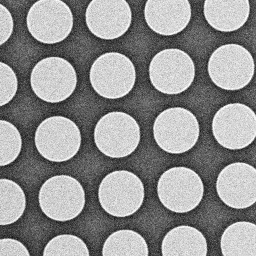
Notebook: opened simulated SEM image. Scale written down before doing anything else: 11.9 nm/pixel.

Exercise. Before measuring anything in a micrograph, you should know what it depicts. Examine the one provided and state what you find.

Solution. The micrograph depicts an array of small figures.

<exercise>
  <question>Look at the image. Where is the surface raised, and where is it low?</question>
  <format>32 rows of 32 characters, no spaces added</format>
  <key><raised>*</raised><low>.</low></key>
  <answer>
....****...*****..******..*****.
*...*****..*****..******..*****.
**.******..*****..******..*****.
**..*****..*****...****....***..
*...****....***.................
................................
....................***....****.
.....***....****...*****..******
*...*****..******..*****..******
**..*****..******..*****..*****.
**..*****...*****..*****...****.
**..*****...****....***.........
*.....**........................
............................***.
.............***....****...*****
*....****...*****..******..*****
**...*****..*****..******..*****
***.******..*****...*****..*****
***..*****..*****...****.....*..
**...****.....**................
*............................**.
..............**.....***....****
*.....***....****...*****..*****
**...*****..******..*****..*****
***..*****..******..*****..*****
***..*****...*****..*****...***.
***...****....***...............
**.....*........................
......................**.....***
.......**.....***....****...****
***...*****..*****..******..****
***...*****..*****..******..****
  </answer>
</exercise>